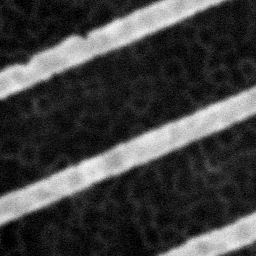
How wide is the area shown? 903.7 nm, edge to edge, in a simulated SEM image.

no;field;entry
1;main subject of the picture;one or a few lines or trenches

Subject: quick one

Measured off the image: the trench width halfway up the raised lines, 327 nanometres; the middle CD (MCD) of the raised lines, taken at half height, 79.4 nm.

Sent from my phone